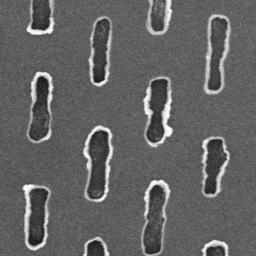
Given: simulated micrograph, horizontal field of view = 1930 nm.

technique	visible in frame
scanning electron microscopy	holes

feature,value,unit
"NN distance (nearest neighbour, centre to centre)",597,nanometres